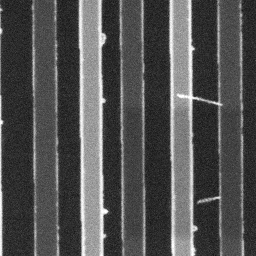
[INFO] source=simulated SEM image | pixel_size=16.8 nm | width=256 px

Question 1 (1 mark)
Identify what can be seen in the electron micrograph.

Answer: lines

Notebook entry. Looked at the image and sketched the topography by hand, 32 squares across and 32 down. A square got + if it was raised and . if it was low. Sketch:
....+++...+++..+++...+++...+++..
....+++...+++..+++...+++...+++..
....+++...+++..+++...+++...+++..
....+++...+++..+++...+++...+++..
....+++...+++..+++...+++...+++..
....+++...+++..+++...+++...+++..
....+++...+++..+++...+++...+++..
....+++...+++..+++...+++...+++..
....+++...+++..+++...+++...+++..
....+++...+++..+++...+++...+++..
....+++...+++..+++...+++...+++..
....+++...+++..+++...+++...+++..
....+++...+++..+++...+++...+++..
....+++...+++..+++....++...+++..
....+++...+++..+++....++...+++..
....+++...+++..+++....++...+++..
....+++...+++..+++....++...+++..
....+++...+++..+++....++...+++..
....+++...+++..+++....++....++..
....+++...+++..+++....++....++..
....+++...+++..+++....++....++..
....+++...+++..+++....++....++..
....+++...+++..+++....++....++..
....+++...+++..+++....++....++..
....+++...+++..+++....++...+++..
....+++...+++..+++....++....++..
....+++...+++..+++....++....++..
....+++...+++..+++....++....++..
....+++...+++..+++....++....++..
....+++...+++..+++....++....++..
....+++...+++..+++....++....++..
....+++...+++..+++....++....++..